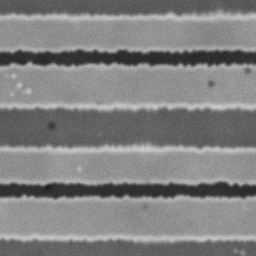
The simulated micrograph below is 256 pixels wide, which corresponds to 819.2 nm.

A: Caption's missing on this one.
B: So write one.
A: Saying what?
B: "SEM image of lines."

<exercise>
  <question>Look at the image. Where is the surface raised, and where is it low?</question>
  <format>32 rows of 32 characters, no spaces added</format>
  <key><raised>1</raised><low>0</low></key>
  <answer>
00000000000000000000000000000000
00000000000000000000000000000000
11111111111111111111111111111111
11111111111111111111111111111111
11111111111111111111111111111111
11111111111111111111111111111111
00000000000000000000000000000000
00000000000000000000000000000000
11111111111111111111111111111111
11111111111111111111111111111111
11111111111111111111111111111111
11111111111111111111111111111111
11111111111111111111111111111111
00000000000001000000000000000001
00000000000000000000000000000000
00000000000000000000000000000000
00000000000000000000000000000000
00000000000000000000000000000000
10000100000001001110011000000000
11111111111111111111111111111111
11111111111111111111111111111111
11111111111111111111111111111111
11111111111111111111111111111111
00000000000000000000000000000000
00000000000000000000001000000000
11111111111111111111111111111111
11111111111111111111111111111111
11111111111111111111111111111111
11111111111111111111111111111111
11111111111111111111111111111111
00000000000000000000000000000000
00000000000000000000000000000000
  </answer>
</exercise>